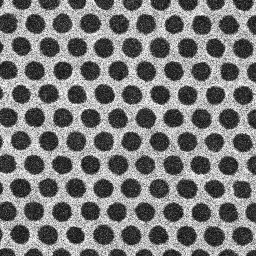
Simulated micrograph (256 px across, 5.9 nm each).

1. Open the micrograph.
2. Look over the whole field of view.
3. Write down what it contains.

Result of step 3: a regular array of holes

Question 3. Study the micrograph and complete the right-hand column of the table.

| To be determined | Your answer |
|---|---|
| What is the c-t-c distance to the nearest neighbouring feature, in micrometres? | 0.159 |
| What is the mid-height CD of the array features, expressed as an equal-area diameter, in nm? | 117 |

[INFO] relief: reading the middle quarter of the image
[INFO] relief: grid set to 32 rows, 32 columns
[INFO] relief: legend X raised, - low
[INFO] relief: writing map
--XX-----XX-----XX----XXX----XXX
--XX-----XX-----XX-----XX-----XX
--XX-----XX-----XX-----XX-----XX
-XXXX----XXX---XXXX----XXX---XXX
XXXXXXXXXXXXXXXXXXXXXXXXXXXXXXXX
XX--XXXXX---XXXX-XXXXXX--XXXXX-X
X----XXX----XXX----XXX----XXX---
X-----XX-----X------X------X----
X-----XX-----XX-----XX----XX----
XX---XXXX---XXX----XXX----XXX---
XXXXXXXXXXXXXXXXXXXXXXXXXXXXXXXX
-XXXX---XXXX---XXXX---XXXX--XXXX
--XX-----XX-----XX-----XX-----XX
--XX-----XX-----XX-----XX-----XX
--XX-----XX-----XX-----XX-----XX
-XXXX---XXXX---XXXX---XXXX---XXX
XXXXXXXXXXXXXXXXXXXXXXXXXXXXXXXX
X---XXXX----XXX---XXXX---XXXX---
X----XXX----XXX----XXX----XXX---
X-----X-----XX------X------X----
X----XXX----XXX----XXX----XXX---
XX---XXXX--XXXXX--XXXXX--XXXX---
XXXXXXXXXXXXXXXXXXXXXXXXXXXXXXXX
-XXXX---XXXX---XXXX---XXXX---XXX
--XX-----XX-----XX-----XX----XXX
--XX-----XX-----XX-----XX-----XX
--XXX----XX-----XX-----XX----XXX
-XXXXX--XXXXX--XXXXX-XXXXX---XXX
XXXXXXXXXXXXXXXXXXXXXXXXXXXXXXXX
X----XXX----XXX---XXXX----XXX---
-----XXX----XX-----XX-----XX----
------X-----XX-----XX-----XX----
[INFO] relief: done